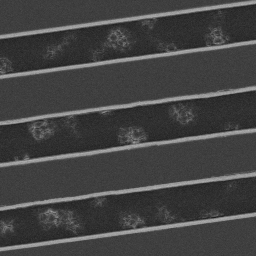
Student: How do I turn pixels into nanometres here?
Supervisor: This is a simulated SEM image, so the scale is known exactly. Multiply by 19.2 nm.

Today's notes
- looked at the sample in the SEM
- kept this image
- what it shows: one or a few lines or trenches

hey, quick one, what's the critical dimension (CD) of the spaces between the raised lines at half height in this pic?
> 790 nm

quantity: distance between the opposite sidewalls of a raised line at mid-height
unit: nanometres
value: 857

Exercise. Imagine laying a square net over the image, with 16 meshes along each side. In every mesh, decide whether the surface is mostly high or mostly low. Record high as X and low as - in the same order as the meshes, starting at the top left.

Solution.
XXXXXXXXXXXXX---
XXXXXX----------
----------------
----------XXXXXX
--XXXXXXXXXXXXXX
XXXXXXXXXXXXXXXX
XXXXXXXXX-------
XX--------------
-------------XXX
------XXXXXXXXXX
XXXXXXXXXXXXXXXX
XXXXXXXXXXX-----
XXXX------------
---------------X
--------XXXXXXXX
XXXXXXXXXXXXXXXX